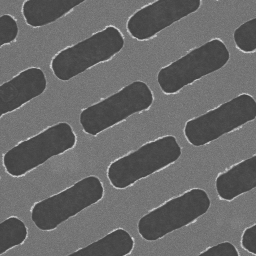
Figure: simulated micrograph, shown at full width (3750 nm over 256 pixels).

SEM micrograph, holes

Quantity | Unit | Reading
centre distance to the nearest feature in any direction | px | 61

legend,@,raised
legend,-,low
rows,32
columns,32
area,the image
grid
@@@-------@@@@@@@@@------@@@@@@@
@@@-----@@@@@@@@@-------@@@@@@@@
--@----@@@@@@@@@------@@@@@@@@@-
--@@@@@@@@@@@-@@-----@@@@@@@@@--
--@@@@@@@@@----@@--@@@@@@@@@@---
-@@@@@@@@@-----@@@@@@@@@@@--@@--
@@@@@@@@-------@@@@@@@@@-----@@@
@@@@@@@------@@@@@@@@@------@@@@
@@@@@@@----@@@@@@@@@@-------@@@@
@@----@--@@@@@@@@@@@-----@@@@@@@
------@@@@@@@@@@--@@----@@@@@@@@
-----@@@@@@@@@@----@@-@@@@@@@@@@
----@@@@@@@@@------@@@@@@@@@@---
--@@@@@@@@@-------@@@@@@@@@-----
@@@@@@@@@@------@@@@@@@@@-------
@@@@@@@-@@----@@@@@@@@@-------@@
@@@@@----@@--@@@@@@@@@@------@@@
@@@------@@@@@@@@@@@--@@---@@@@@
@@-------@@@@@@@@@----@@@@@@@@@@
@------@@@@@@@@@------@@@@@@@@@@
@----@@@@@@@@@-------@@@@@@@@@--
@--@@@@@@@@@@@-----@@@@@@@@@----
@@@@@@@@@@--@@---@@@@@@@@@@-----
@@@@@@@@@----@@@@@@@@@@@@@@-----
@@@@@@@------@@@@@@@@@@---@@--@@
@@@@@-------@@@@@@@@@-----@@@@@@
@@@@------@@@@@@@@@-------@@@@@@
@-@@----@@@@@@@@@@------@@@@@@@@
---@@--@@@@@@@@@@------@@@@@@@@-
---@@@@@@@@@@---@@--@@@@@@@@@@--
--@@@@@@@@@------@@@@@@@@@@@-@--
-@@@@@@@@-------@@@@@@@@@@----@-